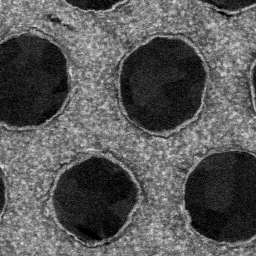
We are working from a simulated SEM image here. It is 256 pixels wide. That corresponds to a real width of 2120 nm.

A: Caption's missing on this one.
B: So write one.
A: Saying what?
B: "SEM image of raised bodies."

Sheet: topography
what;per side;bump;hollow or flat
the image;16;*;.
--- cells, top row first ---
.....**......***
................
***......***....
****....*****...
****...******...
****...******...
****....*****...
***.....****....
................
..............*.
....****....****
...******...****
...******...****
...*****....****
....****....****
................